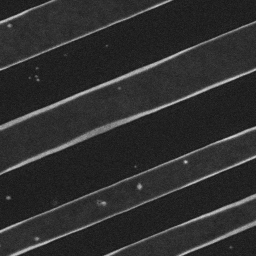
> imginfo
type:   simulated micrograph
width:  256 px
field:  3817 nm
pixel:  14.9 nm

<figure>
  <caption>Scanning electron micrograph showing groups of lines, slits or small figures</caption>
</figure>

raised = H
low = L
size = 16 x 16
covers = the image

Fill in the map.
LLHHHHHHHHLLLLLL
HHHHHHHLLLLLLLLL
HHHHHLLLLLLLLHHH
HHLLLLLLLLLHHHHH
LLLLLLLLHHHHHHHH
LLLLLLHHHHHHHLLL
LLLLHHHHHHHLLLLL
LHHHHHHHLLLLLLLL
HHHHHLLLLLLLLLLH
HHHLLLLLLLLLHHHH
HLLLLLLLLLHHHHLL
LLLLLLLHHHHHLLLL
LLLLLHHHHHLLLLLH
LLHHHHHLLLLLLHHH
HHHHHLLLLLHHHHHL
HHLLLLLLHHHHLLLL